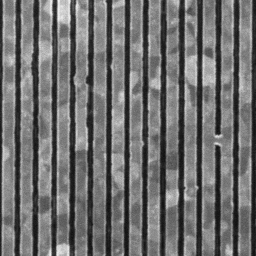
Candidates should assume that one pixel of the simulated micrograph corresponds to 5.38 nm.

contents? parallel lines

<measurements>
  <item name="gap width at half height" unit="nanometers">35.6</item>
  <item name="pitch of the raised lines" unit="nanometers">97.8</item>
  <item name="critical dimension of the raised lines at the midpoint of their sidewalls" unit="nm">61.1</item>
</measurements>